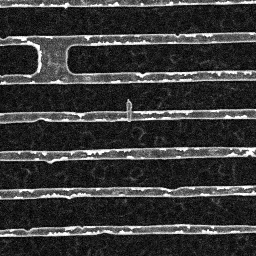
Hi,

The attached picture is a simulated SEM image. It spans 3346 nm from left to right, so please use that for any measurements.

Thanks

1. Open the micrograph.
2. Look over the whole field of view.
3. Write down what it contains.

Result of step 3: parallel lines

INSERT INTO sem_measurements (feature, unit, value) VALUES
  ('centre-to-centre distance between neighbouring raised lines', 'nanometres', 498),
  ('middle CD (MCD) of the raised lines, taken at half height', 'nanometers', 114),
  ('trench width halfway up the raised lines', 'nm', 376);